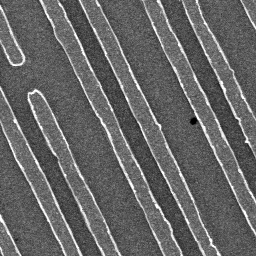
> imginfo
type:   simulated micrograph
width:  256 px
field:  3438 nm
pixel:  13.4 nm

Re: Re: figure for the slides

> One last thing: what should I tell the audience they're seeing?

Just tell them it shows parallel lines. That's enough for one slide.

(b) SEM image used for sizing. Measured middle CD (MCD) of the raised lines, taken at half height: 16.6 pixels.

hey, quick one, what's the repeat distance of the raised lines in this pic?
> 582 nanometres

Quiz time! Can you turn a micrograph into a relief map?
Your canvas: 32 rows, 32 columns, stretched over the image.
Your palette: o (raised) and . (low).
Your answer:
.....ooo..oo......oo...oo.....oo
......oo...oo.....ooo..oo......o
o.....ooo..oo......oo...oo.....o
o......oo...oo.....oo...oo......
oo.....ooo..oo......oo...oo.....
oo......oo...oo.....ooo..oo.....
.oo.....oo...oo......oo...oo....
.oo......oo..ooo.....oo...oo....
.........oo...oo......oo...oo...
..........oo...oo.....oo...oo...
..........oo...oo......oo...oo..
....o......oo..ooo.....oo...oo..
o...oo.....oo...oo......oo..ooo.
o...oo......oo..ooo.....oo...oo.
oo..ooo.....oo...oo......oo..ooo
oo...oo......oo..ooo.....oo...oo
ooo..ooo.....oo...oo......oo..oo
.oo...oo......oo..ooo.....oo...o
.ooo..ooo.....oo...oo......oo..o
..oo...oo......oo..ooo.....oo...
..ooo..oo......oo...oo......oo..
...oo...oo......oo..ooo.....oo..
...ooo..ooo.....oo...oo......oo.
....oo...oo......oo..oo......oo.
....ooo..ooo.....oo...oo.....ooo
.....oo...oo......oo..oo......oo
.....ooo..ooo.....oo...oo.....oo
......oo...oo.....ooo..oo......o
o.....ooo..ooo.....oo...oo.....o
o......oo...oo.....ooo..oo......
oo.....ooo..oo......oo...oo.....
oo......oo...oo.....ooo..oo.....